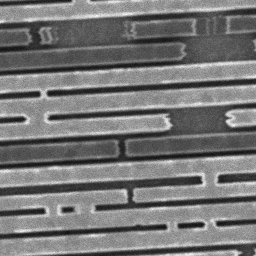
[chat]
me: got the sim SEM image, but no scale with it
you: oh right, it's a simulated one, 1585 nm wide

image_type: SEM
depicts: parallel lines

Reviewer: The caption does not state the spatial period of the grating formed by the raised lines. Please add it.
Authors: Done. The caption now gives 0.144 um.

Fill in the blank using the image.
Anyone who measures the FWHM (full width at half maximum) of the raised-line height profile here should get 106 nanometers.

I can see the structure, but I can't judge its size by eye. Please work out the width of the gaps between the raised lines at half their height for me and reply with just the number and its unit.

42.5 nm